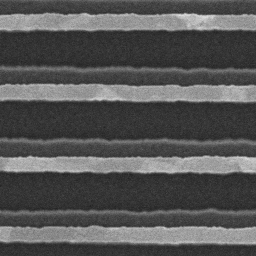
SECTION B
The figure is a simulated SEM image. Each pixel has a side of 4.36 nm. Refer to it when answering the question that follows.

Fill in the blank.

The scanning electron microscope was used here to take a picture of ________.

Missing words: lines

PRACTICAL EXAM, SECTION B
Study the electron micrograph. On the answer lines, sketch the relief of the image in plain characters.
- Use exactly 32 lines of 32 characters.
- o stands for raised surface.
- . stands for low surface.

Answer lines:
oooooooooooooooooooooooooooooooo
oooooooooooooooooooooooooooooooo
oooooooooooooooooooooooooooooooo
oooooooooooooooooooooooooooooooo
................................
................................
................................
................................
o...............................
oooooooooooooooooooooooooooooooo
oooooooooooooooooooooooooooooooo
oooooooooooooooooooooooooooooooo
................oooooo.ooooooooo
................................
................................
................................
................................
ooo....oo..oo.....o.o...........
oooooooooooooooooooooooooooooooo
oooooooooooooooooooooooooooooooo
oooooooooooooooooooooooooooooooo
............oo...oo.oo..ooooo..o
................................
................................
................................
................................
..o....ooooooooo...ooooooooo..oo
oooooooooooooooooooooooooooooooo
oooooooooooooooooooooooooooooooo
oooooooooooooooooooooooooooooooo
..............................oo
................................